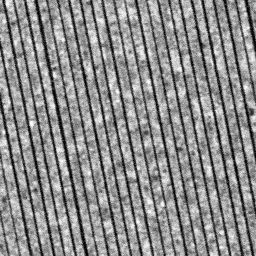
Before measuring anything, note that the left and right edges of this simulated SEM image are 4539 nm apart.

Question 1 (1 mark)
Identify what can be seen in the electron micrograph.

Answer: parallel lines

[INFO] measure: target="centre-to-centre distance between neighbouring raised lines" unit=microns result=0.193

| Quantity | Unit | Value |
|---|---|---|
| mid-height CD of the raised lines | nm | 141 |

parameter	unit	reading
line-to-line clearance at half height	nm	56.6